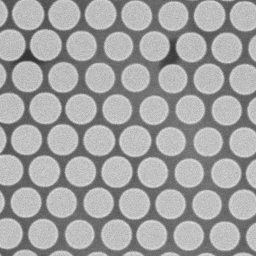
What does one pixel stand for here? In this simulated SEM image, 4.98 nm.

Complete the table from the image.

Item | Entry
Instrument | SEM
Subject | an array of small figures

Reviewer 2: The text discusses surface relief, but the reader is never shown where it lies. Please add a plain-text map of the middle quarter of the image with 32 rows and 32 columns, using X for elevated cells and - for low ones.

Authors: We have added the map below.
XX-----XXXX-----XXXX------XXX---
XXX---XXXXXX---XXXXXX---XXXXXX--
XXX---XXXXXXX--XXXXXX---XXXXXX--
XXX---XXXXXXX--XXXXXX---XXXXXXX-
XXX---XXXXXXX--XXXXXX---XXXXXXX-
XXX---XXXXXX---XXXXXX---XXXXXX--
XX-----XXXX-----XXX------XXXX---
--------------------------------
--XXXXX----XXXXX-----XXX------XX
-XXXXXXX--XXXXXX----XXXXX----XXX
-XXXXXXX--XXXXXXX--XXXXXXX--XXXX
-XXXXXXX--XXXXXXX--XXXXXXX--XXXX
-XXXXXXX--XXXXXXX--XXXXXXX--XXXX
-XXXXXX---XXXXXX----XXXXX----XXX
--XXXX------XXX------XXX------XX
X-------XX----------------------
XXX---XXXXX----XXXXXX----XXXX---
XXX--XXXXXXX--XXXXXXX---XXXXXX--
XXX--XXXXXXXX-XXXXXXXX-XXXXXXX--
XXX--XXXXXXXX-XXXXXXXX-XXXXXXX--
XXX--XXXXXXX--XXXXXXX--XXXXXXX--
XX----XXXXXX---XXXXXX---XXXXXX--
X------XXX-----XXXXX-----XXX----
---XX-------XXX-----------------
-XXXXXX----XXXXX----XXXXX----XXX
-XXXXXX---XXXXXXX--XXXXXX---XXXX
XXXXXXXX--XXXXXXX-XXXXXXXX--XXXX
XXXXXXXX--XXXXXXX-XXXXXXXX--XXXX
-XXXXXX---XXXXXXX--XXXXXXX--XXXX
-XXXXXX---XXXXXX----XXXXX----XXX
---XX-------XXX------XXX------XX
X------XXX------XXX-------------